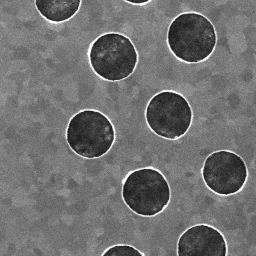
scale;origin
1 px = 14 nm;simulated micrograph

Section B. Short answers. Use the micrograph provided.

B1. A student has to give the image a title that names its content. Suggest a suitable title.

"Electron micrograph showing holes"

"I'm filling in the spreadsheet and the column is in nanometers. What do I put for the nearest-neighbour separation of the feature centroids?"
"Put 1130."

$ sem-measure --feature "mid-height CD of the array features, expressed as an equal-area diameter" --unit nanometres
659